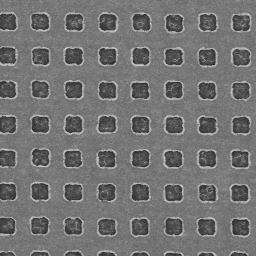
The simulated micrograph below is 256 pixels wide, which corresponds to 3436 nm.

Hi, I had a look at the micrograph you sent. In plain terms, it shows a regular array of holes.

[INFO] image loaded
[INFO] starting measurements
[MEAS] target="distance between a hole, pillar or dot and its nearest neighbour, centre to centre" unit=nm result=445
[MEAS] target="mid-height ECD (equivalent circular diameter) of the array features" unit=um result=0.252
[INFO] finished